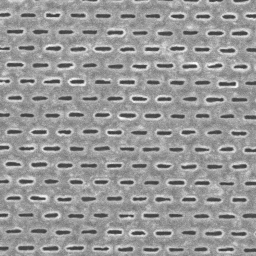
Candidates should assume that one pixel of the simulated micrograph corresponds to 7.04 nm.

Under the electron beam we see a regular array of holes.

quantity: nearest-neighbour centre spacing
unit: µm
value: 0.141